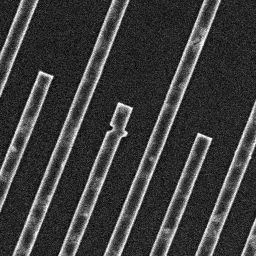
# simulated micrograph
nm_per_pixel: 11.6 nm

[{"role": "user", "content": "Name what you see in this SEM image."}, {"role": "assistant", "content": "parallel lines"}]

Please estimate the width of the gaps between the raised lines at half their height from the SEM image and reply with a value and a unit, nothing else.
313 nanometres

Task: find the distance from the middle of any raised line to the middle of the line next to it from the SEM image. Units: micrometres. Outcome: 0.491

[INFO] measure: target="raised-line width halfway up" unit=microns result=0.176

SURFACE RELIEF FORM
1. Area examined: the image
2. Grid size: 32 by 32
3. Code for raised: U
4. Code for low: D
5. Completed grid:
DDDUUDDDDDDDDDUUDDDDDDDDDUUDDDDD
DDUUDDDDDDDDDDUUDDDDDDDDDUUDDDDD
DDUUDDDDDDDDDUUDDDDDDDDDDUUDDDDD
DUUDDDDDDDDDDUUDDDDDDDDDUUDDDDDD
DUUDDDDDDDDDUUDDDDDDDDDDUUDDDDDD
DUUDDDDDDDDDUUDDDDDDDDDUUDDDDDDD
UUDDDDDDDDDDUUDDDDDDDDDUUDDDDDDD
UUDDDDDDDDDUUDDDDDDDDDDUUDDDDDDD
UDDDDDDDDDDUUDDDDDDDDDUUDDDDDDDD
UDDDDUDDDDUUDDDDDDDDDDUUDDDDDDDD
UDDDUUDDDDUUDDDDDDDDDUUDDDDDDDDD
DDDDUUDDDDUUDDDDDDDDDUUDDDDDDDDD
DDDDUDDDDUUDDDDDDDDDDUUDDDDDDDDD
DDDUUDDDDUUDDDDUDDDDUUDDDDDDDDDD
DDDUUDDDUUDDDDUUDDDDUUDDDDDDDDDU
DDUUDDDDUUDDDDUUDDDDUDDDDDDDDDDU
DDUUDDDDUUDDDDUUDDDUUDDDDDDDDDUU
DDUUDDDUUDDDDUUDDDDUUDDDUUDDDDUU
DUUDDDDUUDDDDUUDDDUUDDDDUUDDDDUU
DUUDDDUUUDDDUUDDDDUUDDDDUUDDDUUD
UUDDDDUUDDDDUUDDDDUDDDDUUDDDDUUD
UUDDDDUUDDDUUDDDDUUDDDDUUDDDDUUD
UUDDDUUDDDDUUDDDDUUDDDUUDDDDUUDD
UDDDDUUDDDDUUDDDUUDDDDUUDDDDUUDD
UDDDDUUDDDUUDDDDUUDDDDUUDDDUUDDD
DDDDUUDDDDUUDDDDUUDDDUUDDDDUUDDD
DDDDUUDDDUUDDDDUUDDDDUUDDDDUUDDD
DDDUUDDDDUUDDDDUUDDDUUUDDDUUDDDD
DDDUUDDDDUUDDDUUDDDDUUDDDDUUDDDU
DDDUUDDDUUDDDDUUDDDDUUDDDUUDDDDU
DDUUDDDDUUDDDDUUDDDUUDDDDUUDDDDU
DDUUDDDUUDDDDUUDDDDUUDDDDUUDDDUU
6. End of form